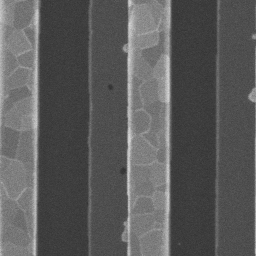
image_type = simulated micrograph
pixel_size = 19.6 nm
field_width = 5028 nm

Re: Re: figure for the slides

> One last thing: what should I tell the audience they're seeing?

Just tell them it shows lines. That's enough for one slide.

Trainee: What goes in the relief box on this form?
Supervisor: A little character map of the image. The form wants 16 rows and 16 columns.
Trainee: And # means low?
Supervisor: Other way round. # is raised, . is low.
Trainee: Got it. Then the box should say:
##....#####...##
##....#####...##
##....#####...##
##....#####...##
##....#####...##
##....#####...##
##....#####...##
##....#####...##
##....#####...##
##....#####...##
##....#####...##
##....#####...##
##....#####...##
##....#####...##
##....#####...##
##....#####...##